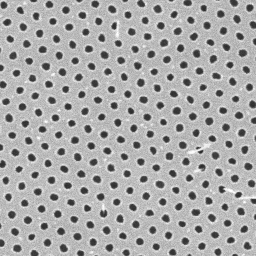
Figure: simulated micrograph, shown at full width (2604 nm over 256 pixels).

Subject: a regular array of holes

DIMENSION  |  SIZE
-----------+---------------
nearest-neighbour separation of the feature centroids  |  171 nm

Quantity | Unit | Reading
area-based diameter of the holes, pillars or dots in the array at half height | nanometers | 75.3